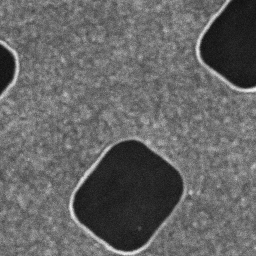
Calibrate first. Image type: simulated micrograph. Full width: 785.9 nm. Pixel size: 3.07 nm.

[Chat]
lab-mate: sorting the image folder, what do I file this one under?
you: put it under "holes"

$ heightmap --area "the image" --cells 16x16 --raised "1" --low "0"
1111111111111100
1111111111111000
1111111111111000
0111111111111000
0111111111111100
1111111111111110
1111111111111111
1111111111111111
1111111111111111
1111111000111111
1111110000011111
1111100000011111
1111100000011111
1111100000011111
1111110000111111
1111111001111111